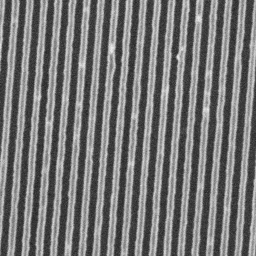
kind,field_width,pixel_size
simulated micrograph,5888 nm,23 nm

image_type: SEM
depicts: parallel lines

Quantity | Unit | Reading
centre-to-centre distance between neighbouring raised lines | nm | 325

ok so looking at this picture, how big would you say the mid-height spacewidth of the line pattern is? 192 nm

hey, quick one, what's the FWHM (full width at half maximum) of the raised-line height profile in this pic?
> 5.86 px